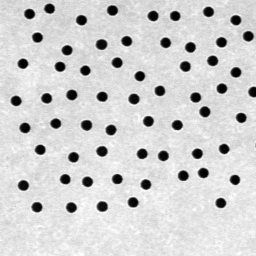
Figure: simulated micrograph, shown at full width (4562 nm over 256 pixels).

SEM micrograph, a regular array of holes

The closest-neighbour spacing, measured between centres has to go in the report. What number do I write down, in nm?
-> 422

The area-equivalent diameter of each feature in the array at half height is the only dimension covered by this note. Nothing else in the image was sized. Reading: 198 nanometres